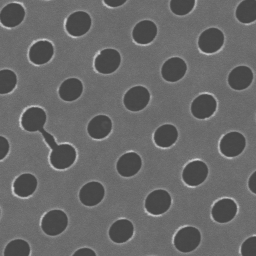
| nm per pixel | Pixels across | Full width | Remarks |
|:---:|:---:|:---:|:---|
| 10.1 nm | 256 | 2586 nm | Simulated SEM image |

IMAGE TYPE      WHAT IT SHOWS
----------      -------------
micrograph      a regular array of holes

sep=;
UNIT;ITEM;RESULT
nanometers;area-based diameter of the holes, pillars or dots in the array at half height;254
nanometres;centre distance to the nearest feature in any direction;474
